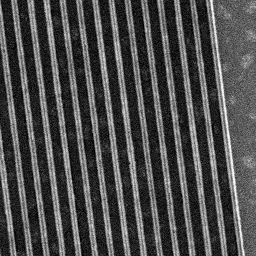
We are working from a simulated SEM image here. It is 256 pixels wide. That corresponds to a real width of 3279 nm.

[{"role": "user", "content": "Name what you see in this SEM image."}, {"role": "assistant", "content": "parallel lines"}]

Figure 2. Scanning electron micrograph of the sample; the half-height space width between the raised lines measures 151 nanometres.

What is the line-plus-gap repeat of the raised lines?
206 nanometres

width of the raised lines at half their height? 57.2 nanometres